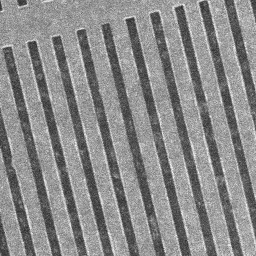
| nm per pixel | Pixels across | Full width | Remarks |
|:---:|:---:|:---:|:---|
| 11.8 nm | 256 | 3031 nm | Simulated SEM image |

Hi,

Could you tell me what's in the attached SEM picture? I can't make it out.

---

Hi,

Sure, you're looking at parallel lines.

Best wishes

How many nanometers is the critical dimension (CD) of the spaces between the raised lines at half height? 125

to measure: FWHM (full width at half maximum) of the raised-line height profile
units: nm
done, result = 171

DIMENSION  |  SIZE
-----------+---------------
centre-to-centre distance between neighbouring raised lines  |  298 nm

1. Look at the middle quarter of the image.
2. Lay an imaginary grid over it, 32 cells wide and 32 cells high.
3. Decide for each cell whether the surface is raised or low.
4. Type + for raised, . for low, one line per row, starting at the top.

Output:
.++++...++++..++++...+++...++++.
.++++...++++..++++...++++..++++.
..+++...++++...+++...++++...+++.
..++++..++++...++++..++++...++++
..++++...+++...++++...+++...++++
..++++...++++..++++...++++..++++
...+++...++++...+++...++++...+++
...++++..++++...++++..++++...+++
...++++...+++...++++...+++...+++
+..++++...++++..++++...++++..+++
+...+++...++++..++++...++++...++
+...+++...++++...++++..++++...++
+...++++...+++...++++..++++...++
++..++++...++++..++++...++++..++
++...+++...++++..++++...++++...+
++...+++...++++...++++..++++...+
++...++++..++++...++++...+++...+
++...++++...++++..++++...+++...+
+++...+++...++++..++++...++++...
+++...++++..++++...++++..++++...
+++...++++..++++...++++..++++...
+++...++++...++++..++++...+++...
++++..++++...++++..++++...++++..
++++...+++...++++...+++...++++..
.+++...++++..++++...++++..++++..
.+++...++++...++++..++++...+++..
.++++..++++...++++..++++...++++.
.++++...+++...++++...+++...++++.
.++++...++++..++++...++++..++++.
..+++...++++...+++...++++..++++.
..++++..++++...++++..++++...++++
..++++...++++..++++...+++...++++